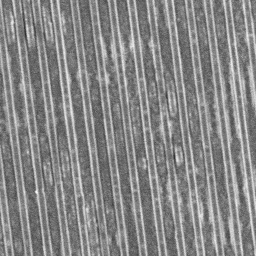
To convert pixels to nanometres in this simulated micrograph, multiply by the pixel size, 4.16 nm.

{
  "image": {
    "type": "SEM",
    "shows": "parallel lines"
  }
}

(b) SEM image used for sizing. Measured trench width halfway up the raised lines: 49 nm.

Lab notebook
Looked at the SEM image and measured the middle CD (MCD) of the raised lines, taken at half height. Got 28.4 nanometers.